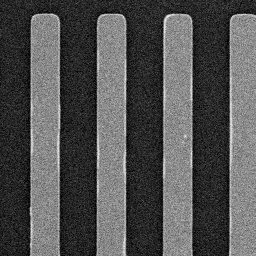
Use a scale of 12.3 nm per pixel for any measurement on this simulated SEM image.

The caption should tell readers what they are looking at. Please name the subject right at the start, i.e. groups of lines, slits or small figures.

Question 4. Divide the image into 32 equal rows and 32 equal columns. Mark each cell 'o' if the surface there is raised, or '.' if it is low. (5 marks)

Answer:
................................
................................
....ooo.....oooo.....ooo.....ooo
....ooo.....oooo.....ooo.....ooo
....ooo.....oooo.....ooo.....ooo
....ooo.....oooo.....ooo.....ooo
....ooo.....oooo.....ooo.....ooo
....ooo.....oooo.....ooo.....ooo
....ooo.....oooo.....ooo.....ooo
....ooo.....oooo.....ooo.....ooo
....ooo.....oooo.....ooo.....ooo
....ooo.....oooo.....ooo.....ooo
....ooo.....oooo.....ooo.....ooo
....ooo.....oooo.....ooo.....ooo
....ooo.....oooo.....ooo.....ooo
....ooo.....oooo.....ooo.....ooo
....ooo.....oooo.....ooo.....ooo
....ooo.....oooo.....ooo.....ooo
....ooo.....oooo.....ooo.....ooo
....ooo.....oooo.....ooo.....ooo
....ooo.....oooo.....ooo.....ooo
....ooo.....oooo.....ooo.....ooo
....ooo.....oooo.....ooo.....ooo
....ooo.....oooo.....ooo.....ooo
....ooo.....oooo.....ooo.....ooo
....ooo.....oooo.....ooo.....ooo
....ooo.....oooo.....ooo.....ooo
....ooo.....oooo.....ooo.....ooo
....ooo.....oooo.....ooo.....ooo
....ooo.....oooo.....ooo.....ooo
....ooo.....oooo.....ooo.....ooo
....ooo.....oooo....oooo.....ooo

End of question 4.